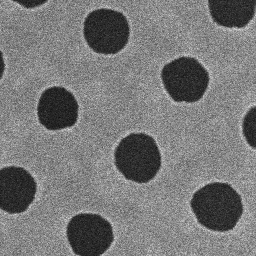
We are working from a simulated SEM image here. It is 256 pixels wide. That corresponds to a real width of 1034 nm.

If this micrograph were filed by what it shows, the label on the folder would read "holes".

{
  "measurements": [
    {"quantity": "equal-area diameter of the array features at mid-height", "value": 188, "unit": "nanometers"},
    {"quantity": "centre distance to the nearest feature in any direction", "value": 371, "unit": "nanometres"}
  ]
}